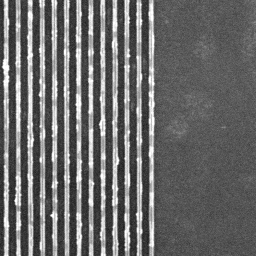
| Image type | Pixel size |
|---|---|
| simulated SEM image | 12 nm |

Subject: parallel lines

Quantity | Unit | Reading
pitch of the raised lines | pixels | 12.1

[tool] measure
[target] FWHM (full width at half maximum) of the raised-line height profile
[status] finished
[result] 42 nanometres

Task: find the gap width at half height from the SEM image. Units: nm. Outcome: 105